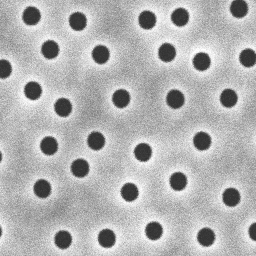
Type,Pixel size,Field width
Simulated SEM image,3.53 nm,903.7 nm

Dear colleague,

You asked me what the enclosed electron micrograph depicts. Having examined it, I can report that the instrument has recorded a regular array of holes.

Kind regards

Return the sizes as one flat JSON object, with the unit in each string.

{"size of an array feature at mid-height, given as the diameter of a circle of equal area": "66 nm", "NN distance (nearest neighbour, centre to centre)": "0.145 um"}